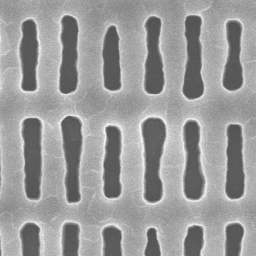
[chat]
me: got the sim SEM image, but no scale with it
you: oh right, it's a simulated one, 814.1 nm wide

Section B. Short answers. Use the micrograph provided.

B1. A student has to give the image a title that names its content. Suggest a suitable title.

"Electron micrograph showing a regular array of holes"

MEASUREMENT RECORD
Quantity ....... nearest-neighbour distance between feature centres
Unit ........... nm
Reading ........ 126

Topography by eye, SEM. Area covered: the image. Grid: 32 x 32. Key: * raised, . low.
********************************
********************************
********.*********..***..*******
***..***..********..***..***..**
***..***..***..***..***..***..**
***..***..***..***..***..****.**
***..***..***..***..***..****.**
***..***..***..***..***..***..**
***..***..***..***..***..***..**
***..**...***..***..***..***..**
***..**...***..***..***..***..**
********.*********..***..*******
********************************
********************************
********************************
***..***..********...**..*******
***..***..***..***...**..***..**
***..***..***..***...**..***..**
***..***..***..***..***..***..**
***..***..***..***..***..***..**
***..***..***..***..***..***..**
***..***..***..***..***..***..**
***..***..***..***..***...**...*
***..***..***..***..***..***...*
***..***..***..***..***..***..**
********************************
********************************
********************************
***..***..***..*********.***..**
***..***..***..***..***..***..**
***..***..***..***..***..***..**
***..***..***..***..***..***..**